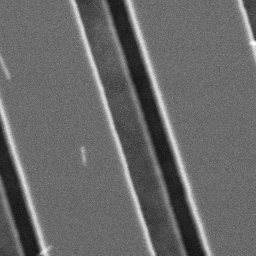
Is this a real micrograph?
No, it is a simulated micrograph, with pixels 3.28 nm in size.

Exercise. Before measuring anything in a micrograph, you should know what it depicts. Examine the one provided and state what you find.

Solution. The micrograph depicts lines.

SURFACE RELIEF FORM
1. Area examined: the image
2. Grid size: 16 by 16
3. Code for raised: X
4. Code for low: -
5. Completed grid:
XXXXX---XXXXXXX-
XXXXX---XXXXXXXX
XXXXX----XXXXXXX
XXXXXX---XXXXXXX
XXXXXX---XXXXXXX
XXXXXX----XXXXXX
XXXXXXX---XXXXXX
XXXXXXX---XXXXXX
XXXXXXX----XXXXX
-XXXXXXX---XXXXX
-XXXXXXX---XXXXX
-XXXXXXX----XXXX
--XXXXXXX---XXXX
--XXXXXXX---XXXX
--XXXXXXX---XXXX
---XXXXXXX---XXX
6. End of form